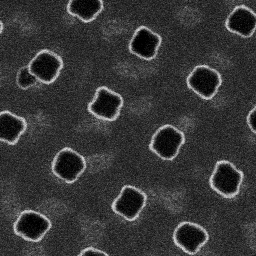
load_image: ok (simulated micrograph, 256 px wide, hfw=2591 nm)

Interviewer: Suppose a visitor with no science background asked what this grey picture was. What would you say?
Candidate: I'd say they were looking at a regular array of raised bodies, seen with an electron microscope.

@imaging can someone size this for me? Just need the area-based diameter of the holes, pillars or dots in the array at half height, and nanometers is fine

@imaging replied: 314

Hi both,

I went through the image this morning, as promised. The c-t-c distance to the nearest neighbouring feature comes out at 712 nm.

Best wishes